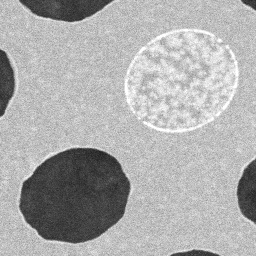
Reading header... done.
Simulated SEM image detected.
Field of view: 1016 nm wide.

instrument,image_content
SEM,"holes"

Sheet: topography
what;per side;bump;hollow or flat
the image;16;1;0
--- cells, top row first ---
1100001111111111
1111111111111111
1111111111111111
1111111111111111
0111111111111111
0111111111111111
0111111111111111
1111111111111111
1111111111111111
1111000111111111
1100000011111110
1000000011111110
1000000011111110
1000000011111110
1100000111111111
1111111111111111